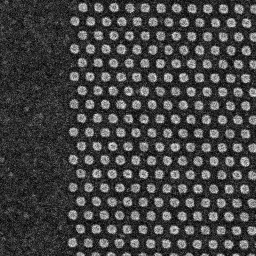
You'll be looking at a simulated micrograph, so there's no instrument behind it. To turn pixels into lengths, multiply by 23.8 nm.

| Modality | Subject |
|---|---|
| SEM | a regular array of raised bodies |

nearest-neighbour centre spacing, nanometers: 367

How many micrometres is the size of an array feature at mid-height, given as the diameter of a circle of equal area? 0.204